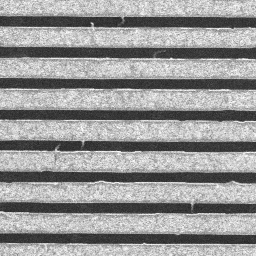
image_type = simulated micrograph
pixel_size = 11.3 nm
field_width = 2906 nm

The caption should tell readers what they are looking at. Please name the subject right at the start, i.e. parallel lines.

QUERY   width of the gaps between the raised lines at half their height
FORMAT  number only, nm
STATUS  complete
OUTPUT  114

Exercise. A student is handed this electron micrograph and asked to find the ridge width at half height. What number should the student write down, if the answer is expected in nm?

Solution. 237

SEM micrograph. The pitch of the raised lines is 352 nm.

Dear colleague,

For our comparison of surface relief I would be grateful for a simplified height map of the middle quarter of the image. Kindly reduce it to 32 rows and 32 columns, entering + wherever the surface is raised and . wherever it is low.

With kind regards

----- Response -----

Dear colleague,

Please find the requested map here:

++++++++++++++++++++++++++++++++
++++++++++++++++++++++++++++++++
++++++++++++++++++++++++++++++++
++++++++++++++++++++++++++++++++
................................
................................
+++++++++++++++++++++++.........
++++++++++++++++++++++++++++++++
++++++++++++++++++++++++++++++++
++++++++++++++++++++++++++++++++
++++++++++++++++++++++++++++++++
..........................++++++
................................
................................
++++++++++++++++++++++++++++++++
++++++++++++++++++++++++++++++++
++++++++++++++++++++++++++++++++
++++++++++++++++++++++++++++++++
++++++++++++++++++++++++++++++++
....+...........................
................................
................................
++++++++++++++++++++++++++++++++
++++++++++++++++++++++++++++++++
++++++++++++++++++++++++++++++++
++++++++++++++++++++++++++++++++
++++++++++++++++++++++++++++++++
................................
................................
........+++.....................
++++++++++++++++++++++++++++++++
++++++++++++++++++++++++++++++++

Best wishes